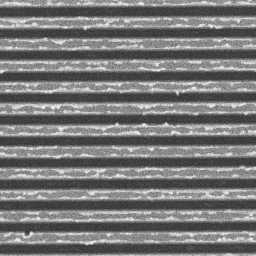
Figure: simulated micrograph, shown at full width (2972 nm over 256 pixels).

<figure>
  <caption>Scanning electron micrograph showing parallel lines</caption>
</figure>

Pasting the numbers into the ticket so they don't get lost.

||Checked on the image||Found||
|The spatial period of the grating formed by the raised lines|0.25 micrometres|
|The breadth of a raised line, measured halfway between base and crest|122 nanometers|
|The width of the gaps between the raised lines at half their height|11.4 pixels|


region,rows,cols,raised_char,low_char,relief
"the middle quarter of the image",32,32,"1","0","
11111111111111111111111111111111
11111111111111111111111111111111
00000000000000000000000000000000
00000000000000000000000000000000
00000000000000000000000100011111
11111111111111111111111111111111
11111111111111111111111111111111
00000000000000000000000000000000
00000000000000000000000000000000
00000000000000000000000000000000
11111111111111111111111111111111
11111111111111111111111111111111
00000000000000000001100100000001
00000000000000000000000000000000
00000000000000000000000000000000
00111111111111111111111111111111
11111111111111111111111111111111
11111111111111111111111111111111
00000000000000000000000000000000
00000000000000000000000000000000
00000000000010000000000000000000
11111111111111111111111111111111
11111111111111111111111111111111
00000000000000000000000000000000
00000000000000000000000000000000
00000000000000000000000000000000
11111111111111111111111111111111
11111111111111111111111111111111
11111111111111111111100000000000
00000000000000000000000000000000
00000000000000000000000000000000
01110000000000000000011100000000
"